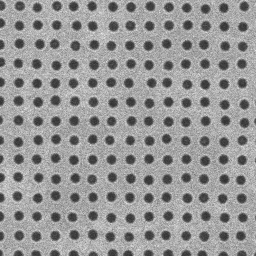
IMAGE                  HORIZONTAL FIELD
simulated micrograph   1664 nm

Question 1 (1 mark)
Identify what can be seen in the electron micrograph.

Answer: a regular array of holes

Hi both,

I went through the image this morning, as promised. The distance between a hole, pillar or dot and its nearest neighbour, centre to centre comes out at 116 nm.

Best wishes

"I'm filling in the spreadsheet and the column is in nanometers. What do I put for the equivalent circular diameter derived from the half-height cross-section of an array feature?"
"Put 69.6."